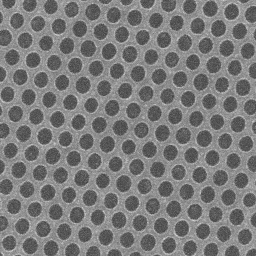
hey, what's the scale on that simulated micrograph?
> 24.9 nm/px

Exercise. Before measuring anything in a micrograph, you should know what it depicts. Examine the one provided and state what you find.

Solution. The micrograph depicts a regular array of holes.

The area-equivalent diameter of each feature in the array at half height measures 0.399 micrometres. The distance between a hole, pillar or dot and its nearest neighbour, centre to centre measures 524 nm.